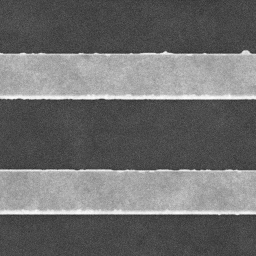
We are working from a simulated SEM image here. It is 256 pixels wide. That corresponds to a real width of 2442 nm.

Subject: lines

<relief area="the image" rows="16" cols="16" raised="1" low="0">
0000000000000000
0000000000000000
0000000000000000
1111111111111111
1111111111111111
1111111111111111
0000000000000000
0000000000000000
0000000000000000
0000000000000000
0000000000000000
1111111111111111
1111111111111111
0000000000000000
0000000000000000
0000000000000000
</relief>